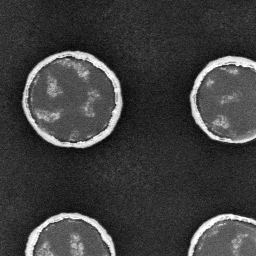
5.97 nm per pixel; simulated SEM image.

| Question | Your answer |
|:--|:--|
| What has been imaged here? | raised bodies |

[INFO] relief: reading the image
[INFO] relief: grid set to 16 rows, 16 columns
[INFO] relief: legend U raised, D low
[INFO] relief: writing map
DDDDDDDDDDDDDDDD
DDDDDDDDDDDDDDDD
DDDDDDDDDDDDDDDD
DDDUUDDDDDDDDDDD
DDUUUUUDDDDDDUUU
DDUUUUUDDDDDUUUU
DDUUUUUDDDDDUUUU
DDUUUUUDDDDDUUUU
DDDUUUDDDDDDDUUU
DDDDDDDDDDDDDDDD
DDDDDDDDDDDDDDDD
DDDDDDDDDDDDDDDD
DDDDDDDDDDDDDDDD
DDDDUDDDDDDDDDUD
DDUUUUDDDDDDUUUU
DDUUUUUDDDDDUUUU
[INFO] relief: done